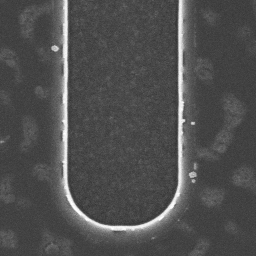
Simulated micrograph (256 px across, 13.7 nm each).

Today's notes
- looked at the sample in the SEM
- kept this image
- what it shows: one or a few lines or trenches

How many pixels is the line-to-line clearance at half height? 114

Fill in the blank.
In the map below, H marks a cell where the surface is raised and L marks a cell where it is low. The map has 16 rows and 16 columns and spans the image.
HHHHLLLLLLLHHHHH
HHHHLLLLLLLHHHHH
HHHHLLLLLLLHHHHH
HHHHLLLLLLLHHHHH
HHHHLLLLLLLHHHHH
HHHHLLLLLLLHHHHH
HHHHLLLLLLLHHHHH
HHHHLLLLLLLHHHHH
HHHHLLLLLLLHHHHH
HHHHLLLLLLLHHHHH
HHHHLLLLLLLHHHHH
HHHHLLLLLLLHHHHH
HHHHLLLLLLLHHHHH
HHHHHLLLLLHHHHHH
HHHHHHHHHHHHHHHH
HHHHHHHHHHHHHHHH